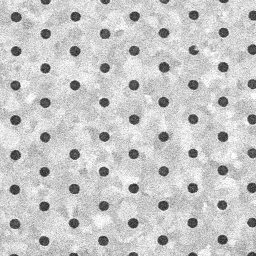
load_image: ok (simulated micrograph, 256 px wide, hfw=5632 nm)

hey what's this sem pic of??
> a regular array of holes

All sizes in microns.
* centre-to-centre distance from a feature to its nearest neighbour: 0.746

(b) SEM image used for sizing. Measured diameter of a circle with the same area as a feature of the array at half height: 238 nm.